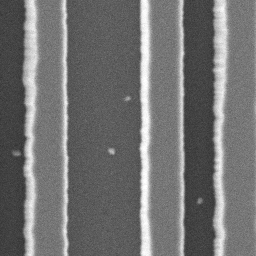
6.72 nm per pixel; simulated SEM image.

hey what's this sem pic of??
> lines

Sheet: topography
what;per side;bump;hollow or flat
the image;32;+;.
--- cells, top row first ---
...+++++..........+++++....+++++
....++++..........+++++....+++++
....++++..........+++++....+++++
...+++++..........+++++....+++++
....++++..........+++++....+++++
....++++..........+++++....+++++
....++++..........+++++....+++++
....++++..........+++++....+++++
...+++++..........+++++....+++++
...+++++..........+++++....+++++
...+++++..........+++++....+++++
....++++..........+++++....+++++
...+++++..........+++++....+++++
....++++..........+++++....+++++
...+++++..........+++++....+++++
...+++++..........+++++....+++++
...+++++..........+++++....+++++
...+++++..........+++++....+++++
...+++++..........+++++....+++++
...+++++..........+++++....+++++
...+++++..........+++++....+++++
...+++++..........+++++....+++++
...+++++..........+++++....+++++
....++++..........+++++....+++++
....++++..........+++++....+++++
...+++++..........+++++....+++++
...+++++..........+++++....+++++
...+++++..........+++++....+++++
...+++++..........+++++....+++++
...+++++..........+++++....+++++
....++++..........+++++....+++++
...+++++..........+++++....+++++